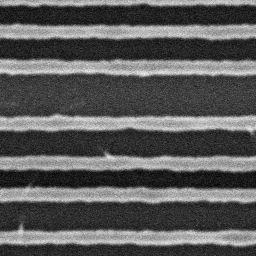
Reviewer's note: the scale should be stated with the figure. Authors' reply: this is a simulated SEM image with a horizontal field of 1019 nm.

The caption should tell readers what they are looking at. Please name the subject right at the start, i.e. lines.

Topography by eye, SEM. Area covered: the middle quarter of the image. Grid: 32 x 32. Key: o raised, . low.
oooooooooooooooooooooooooooooooo
oooooooooooooooooooooooooooooooo
...............oo..ooo..........
................................
................................
................................
................................
................................
................................
................................
................................
................................
................................
oooooooooooo..oooooooooooooooooo
oooooooooooooooooooooooooooooooo
oooooooooooooooooooooooooooooooo
........................oooooo..
................................
................................
................................
................................
................................
................................
ooooooooooooooooooo...oooooooooo
oooooooooooooooooooooooooooooooo
oooooooooooooooooooooooooooooooo
........o..................ooooo
................................
................................
................................
................................
oooooooooooooooooooooooooooooooo